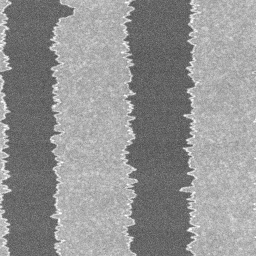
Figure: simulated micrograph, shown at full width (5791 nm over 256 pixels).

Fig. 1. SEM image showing one or a few lines or trenches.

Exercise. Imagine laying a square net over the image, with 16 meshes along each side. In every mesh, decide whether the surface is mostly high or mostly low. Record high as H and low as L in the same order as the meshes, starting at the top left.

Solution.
HHHHLLLLHHHHLLLL
HHHHLLLLHHHHLLLL
HHHLLLLLHHHHLLLL
HHHHLLLLHHHHLLLL
HHHLLLLLHHHHLLLL
HHHHLLLLHHHHLLLL
HHHLLLLLHHHHLLLL
HHHHLLLLHHHHLLLL
HHHLLLLLHHHHLLLL
HHHHLLLLHHHHLLLL
HHHHLLLLHHHHLLLL
HHHHLLLLHHHHLLLL
HHHHLLLLHHHHLLLL
HHHHLLLLHHHHLLLL
HHHHLLLLHHHHLLLL
HHHHLLLLHHHHLLLL